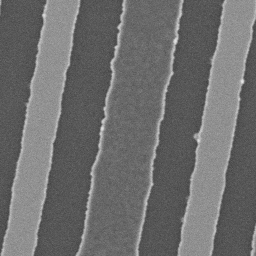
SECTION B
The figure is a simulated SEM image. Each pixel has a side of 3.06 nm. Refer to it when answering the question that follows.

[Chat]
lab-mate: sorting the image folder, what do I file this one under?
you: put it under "lines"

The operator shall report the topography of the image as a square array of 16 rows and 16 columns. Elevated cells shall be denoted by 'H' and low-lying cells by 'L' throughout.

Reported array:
LLLHHLLLHHHLLLHH
LLLHHLLHHHHLLLHH
LLHHHLLHHHHLLLHH
LLHHLLLHHHHLLHHL
LLHHLLLHHHHLLHHL
LLHHLLLHHHLLLHHL
LLHHLLLHHHLLLHHL
LLHHLLHHHHLLLHHL
LHHLLLHHHHLLHHHL
LHHLLLHHHHLLHHLL
LHHLLLHHHHLLHHLL
LHHLLLHHHLLLHHLL
LHHLLLHHHLLLHHLL
LHHLLHHHHLLLHHLL
HHLLLHHHHLLHHLLL
HHLLLHHHHLLHHLLL